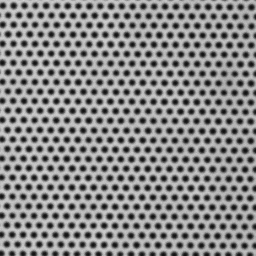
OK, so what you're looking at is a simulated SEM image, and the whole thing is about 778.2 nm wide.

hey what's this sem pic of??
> a regular array of holes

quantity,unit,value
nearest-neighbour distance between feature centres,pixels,10.5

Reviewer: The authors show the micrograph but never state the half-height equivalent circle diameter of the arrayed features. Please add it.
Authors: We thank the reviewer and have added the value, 19.1 nm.